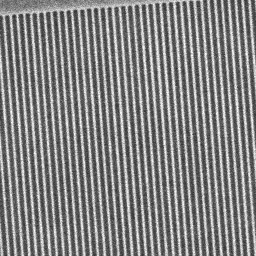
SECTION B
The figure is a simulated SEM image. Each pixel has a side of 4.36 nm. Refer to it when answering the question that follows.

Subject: parallel lines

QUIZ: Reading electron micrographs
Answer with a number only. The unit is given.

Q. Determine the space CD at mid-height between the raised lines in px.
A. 4.5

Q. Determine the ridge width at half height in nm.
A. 8.2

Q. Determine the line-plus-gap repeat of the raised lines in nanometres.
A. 29.8